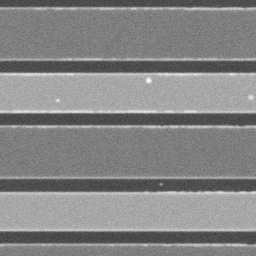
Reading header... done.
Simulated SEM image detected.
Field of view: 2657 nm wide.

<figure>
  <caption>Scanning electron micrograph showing lines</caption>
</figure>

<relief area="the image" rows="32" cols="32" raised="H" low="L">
LLLLLLLLLLLLLLLLLLLLLLLLLLLLLLLL
HHHHHHHHHHHHHHHHHHHHHHHHHHHHHHHH
HHHHHHHHHHHHHHHHHHHHHHHHHHHHHHHH
HHHHHHHHHHHHHHHHHHHHHHHHHHHHHHHH
HHHHHHHHHHHHHHHHHHHHHHHHHHHHHHHH
HHHHHHHHHHHHHHHHHHHHHHHHHHHHHHHH
HHHHHHHHHHHHHHHHHHHHHHHHHHHHHHHH
LLLLLLLLLLLLLLLLLLLLLLLLLLLLLLLL
LLLLLLLLLLLLLLLLLLLLLLLLLLLLLLLL
HHHHHHHHHHHHHHHHHHHHHHHHHHHHHHHH
HHHHHHHHHHHHHHHHHHHHHHHHHHHHHHHH
HHHHHHHHHHHHHHHHHHHHHHHHHHHHHHHH
HHHHHHHHHHHHHHHHHHHHHHHHHHHHHHHH
HHHHHHHHHHHHHHHHHHHHHHHHHHHHHHHH
LLLLLLLLLLLLLLLLLLLLLLLLLLLLLLLL
LLLLLLLLLLLLLLLLLLLLLLLLLLLLLLLL
HHHHHHHHHHHHHHHHHHHHHHHHHHHHHHHH
HHHHHHHHHHHHHHHHHHHHHHHHHHHHHHHH
HHHHHHHHHHHHHHHHHHHHHHHHHHHHHHHH
HHHHHHHHHHHHHHHHHHHHHHHHHHHHHHHH
HHHHHHHHHHHHHHHHHHHHHHHHHHHHHHHH
HHHHHHHHHHHHHHHHHHHHHHHHHHHHHHHH
LLLLLLLLLLLLLLLLLLLLLLLLLLLLLLLL
LLLLLLLLLLLLLLLLLLLLLLLLLLLLLLLL
HHHHHHHHHHHHHHHHHHHHHHHHHHHHHHHH
HHHHHHHHHHHHHHHHHHHHHHHHHHHHHHHH
HHHHHHHHHHHHHHHHHHHHHHHHHHHHHHHH
HHHHHHHHHHHHHHHHHHHHHHHHHHHHHHHH
HHHHHHHHHHHHHHHHHHHHHHHHHHHHHHHH
LLLLLLLLLLLLLLLLLLLLLLLLLLLLLLLL
LLLLLLLLLLLLLLLLLLLLLLLLLLLLLLLL
HHHHHHHHHHHHHHHHHHHHHHHHHHHHHHHH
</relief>